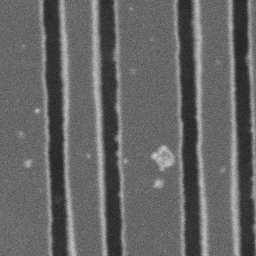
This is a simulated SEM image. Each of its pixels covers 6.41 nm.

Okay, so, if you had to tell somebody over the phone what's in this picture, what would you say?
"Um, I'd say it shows lines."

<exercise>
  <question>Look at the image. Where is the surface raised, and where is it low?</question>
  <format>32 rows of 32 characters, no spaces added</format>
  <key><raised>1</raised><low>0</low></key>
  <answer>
11111001111100111111110011111001
11111000111100111111110011111001
11111000111100111111110011111001
11111000111100011111110011111001
11111100111100011111110011111001
11111100111100011111110001111001
11111100111100011111110011111001
11111100111100011111110011111001
11111100111100011111110001111001
11111100111100011111110001111001
11111100111100011111111001111001
11111100111100011111111001111001
11111100111100011111111001111001
11111100111110011111111001111001
11111100111110011111111001111000
11111100111110011111111001111000
11111100111110011111111001111000
11111100111110011111111001111000
11111100111110011111111001111100
11111100111110011111111001111100
11111100111110011111111001111000
11111100111110011111111001111000
11111100111110011111111001111100
11111100111110011111111001111100
11111100111110011111111001111100
11111100111110011111111001111100
11111100111110011111111001111100
11111100011110011111111001111100
11111100011110011111111001111100
11111100011110011111111001111100
11111100011110011111111001111100
11111100011110011111111001111100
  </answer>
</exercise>